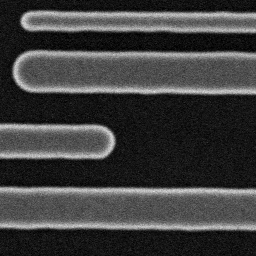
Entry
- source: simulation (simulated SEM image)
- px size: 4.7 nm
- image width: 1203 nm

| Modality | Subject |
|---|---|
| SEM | groups of lines, slits or small figures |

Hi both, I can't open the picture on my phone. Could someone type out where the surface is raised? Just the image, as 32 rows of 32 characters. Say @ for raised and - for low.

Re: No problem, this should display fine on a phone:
--------------------------------
--------------------------------
---@@@@@@@@@@@@@@@@@@@@@@@@@@@@@
---@@@@@@@@@@@@@@@@@@@@@@@@@@@@@
--------------------------------
--------------------------------
----@@@-------------------------
--@@@@@@@@@@@@@@@@@@@@@@@@@@@@@@
--@@@@@@@@@@@@@@@@@@@@@@@@@@@@@@
--@@@@@@@@@@@@@@@@@@@@@@@@@@@@@@
--@@@@@@@@@@@@@@@@@@@@@@@@@@@@@@
-----------------@@@-@@@@@@@@@@@
--------------------------------
--------------------------------
--------------------------------
--------------------------------
@@@@@@@@@@@@@@------------------
@@@@@@@@@@@@@@------------------
@@@@@@@@@@@@@@------------------
@@@@@@@@@@@@@-------------------
--------------------------------
--------------------------------
--------------------------------
--------------------------------
@@@@@@@@@@@@@@@@@@@@@@@@@@@@@@@@
@@@@@@@@@@@@@@@@@@@@@@@@@@@@@@@@
@@@@@@@@@@@@@@@@@@@@@@@@@@@@@@@@
@@@@@@@@@@@@@@@@@@@@@@@@@@@@@@@@
-------------@@@@@@@@@@@@@@@@@@@
--------------------------------
--------------------------------
--------------------------------